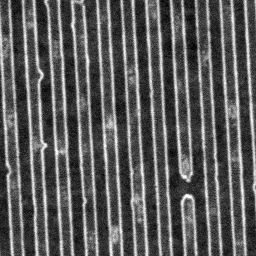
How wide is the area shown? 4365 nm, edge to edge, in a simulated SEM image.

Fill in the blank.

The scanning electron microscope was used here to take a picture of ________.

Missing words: parallel lines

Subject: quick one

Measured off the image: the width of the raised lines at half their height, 0.23 micrometres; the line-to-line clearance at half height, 196 nm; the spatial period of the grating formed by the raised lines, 421 nm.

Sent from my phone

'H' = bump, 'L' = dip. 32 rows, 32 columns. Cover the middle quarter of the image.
HHHLLLHHHLLLHHHLLLHHHLLLHHHLLLLH
HHHLLLHHHLLLHHHLLLHHHLLLHHHHLLLH
HHHLLLHHHLLLHHHLLLHHHLLLHHHHLLLH
HHHLLLHHHLLLHHHLLLHHHLLLHHHHLLLH
HHHLLLHHHLLLHHHLLLLHHLLLLHHHLLLH
HHHLLLHHHLLLHHHHLLHHHHLLLHHHLLLH
HHHLLLHHHLLLHHHHLLHHHHLLLHHHLLLH
HHHLLLHHHLLLHHHHLLHHHHLLLHHHLLLH
HHHLLLHHHLLLLHHHLLLHHHLLLHHHLLLH
HHHLLLHHHLLLLHHHLLLHHHLLLHHHLLLH
HHHHLLHHHHLLLHHHLLLHHHLLLHHHLLLH
HHHHLLHHHHLLLHHHLLHHHHLLLHHHLLLH
HHHHLLLHHHLLLHHHLLLHHHLLLHHHLLLH
HHHHLLLHHHLLLHHHLLLHHHLLLHHHLLLH
HHHHLLLHHHLLLHHHLLLHHHLLLHHHLLLH
HHHHLLLHHHLLLHHHLLLHHHLLLHHHLLLH
HHHHLLLHHHLLLHHHLLLHHHLLLHHHLLLH
LHHHLLLHHHLLLHHHLLLHHHLLLHHHLLLL
LHHHLLLHHHLLLHHHLLLHHHLLLHHHLLLL
LHHHLLLHHHLLLHHHLLLHHHHLLHHHHLLL
LHHHLLLHHHLLLHHHLLLHHHHLLHHHHLLL
LHHHLLLHHHLLLHHHLLLHHHHLLHHHHLLL
LHHHLLLHHHLLLHHHLLLHHHHLLLHHHLLL
LHHHLLLHHHLLLHHHHLLHHHHLLLHHHLLL
LHHHLLLHHHLLLHHHHLLHHHHLLLHHHLLL
LHHHLLLHHHLLLHHHHLLHHHHLLLHHHLHL
LHHHLLLHHHLLLLHHHLLLHHHLLLHHHLLL
LHHHLLLHHHLLLLHHHLLLHHHLLLHHHLLL
LHHHHLLHHHHLLLHHHLLLHHHLLLHHHHLH
LHHHHLLHHHHLLLHHHLLLHHHLLLHHHHHH
LHHHHLLHHHHLLLHHHLLLHHHLLLHHHHHH
LHHHHLLLHHHLLLHHHLLLHHHLLLHHHHHH